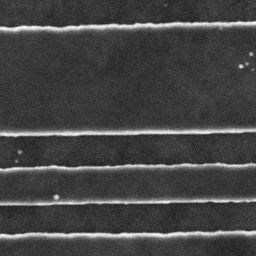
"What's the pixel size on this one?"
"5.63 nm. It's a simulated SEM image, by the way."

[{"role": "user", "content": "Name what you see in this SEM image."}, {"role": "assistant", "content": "lines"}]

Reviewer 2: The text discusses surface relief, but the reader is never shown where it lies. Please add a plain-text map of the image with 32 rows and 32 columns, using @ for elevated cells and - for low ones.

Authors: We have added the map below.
--------------------------------
--------------------------------
--------------------------------
--@@@@@-@@@@@@@@@@@@@@@@@@@@@@@@
@@@@@@@@@@@@@@@@@@@@@@@@@@@@@@@@
@@@@@@@@@@@@@@@@@@@@@@@@@@@@@@@@
@@@@@@@@@@@@@@@@@@@@@@@@@@@@@@@@
@@@@@@@@@@@@@@@@@@@@@@@@@@@@@@@@
@@@@@@@@@@@@@@@@@@@@@@@@@@@@@@@@
@@@@@@@@@@@@@@@@@@@@@@@@@@@@@@@@
@@@@@@@@@@@@@@@@@@@@@@@@@@@@@@@@
@@@@@@@@@@@@@@@@@@@@@@@@@@@@@@@@
@@@@@@@@@@@@@@@@@@@@@@@@@@@@@@@@
@@@@@@@@@@@@@@@@@@@@@@@@@@@@@@@@
@@@@@@@@@@@@@@@@@@@@@@@@@@@@@@@@
@@@@@@@@@@@@@@@@@@@@@@@@@@@@@@@@
@@@@@@@@@@@@@@@@@@@@@@@@@@@@----
--------------------------------
--------------------------------
--------------------------------
---------------------------@----
@@@@@@@@@@@@@@@@@@@@@@@@@@@@@@@@
@@@@@@@@@@@@@@@@@@@@@@@@@@@@@@@@
@@@@@@@@@@@@@@@@@@@@@@@@@@@@@@@@
@@@@@@@@@@@@@@@@@@@@@@@@@@@@@@@@
@@@@@@@-------------------------
--------------------------------
--------------------------------
--------------------------------
@@@@@@@@@@@@@@@@@@@@@@@@@@@@@@@@
@@@@@@@@@@@@@@@@@@@@@@@@@@@@@@@@
@@@@@@@@@@@@@@@@@@@@@@@@@@@@@@@@